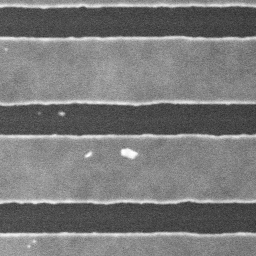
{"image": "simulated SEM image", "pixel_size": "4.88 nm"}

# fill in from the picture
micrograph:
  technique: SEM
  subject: lines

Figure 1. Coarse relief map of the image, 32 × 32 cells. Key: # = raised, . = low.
################################
................................
................................
................................
................................
################################
################################
################################
################################
################################
################################
################################
################################
................................
................................
................................
................................
################################
################################
################################
################################
################################
################################
################################
################################
.............#..................
................................
................................
................................
################################
################################
################################